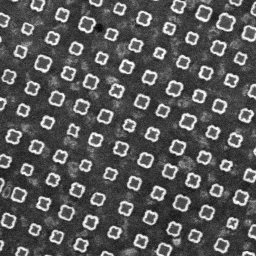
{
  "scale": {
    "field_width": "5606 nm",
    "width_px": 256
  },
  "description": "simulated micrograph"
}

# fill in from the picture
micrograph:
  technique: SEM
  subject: a regular array of raised bodies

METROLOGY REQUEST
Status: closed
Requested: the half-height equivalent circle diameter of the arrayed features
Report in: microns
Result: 0.273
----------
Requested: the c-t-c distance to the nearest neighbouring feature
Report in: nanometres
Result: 540